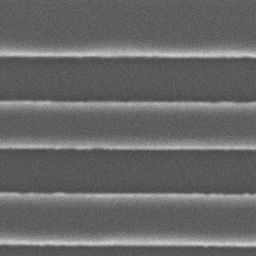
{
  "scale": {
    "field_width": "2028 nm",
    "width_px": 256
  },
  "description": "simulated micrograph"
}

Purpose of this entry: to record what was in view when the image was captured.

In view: lines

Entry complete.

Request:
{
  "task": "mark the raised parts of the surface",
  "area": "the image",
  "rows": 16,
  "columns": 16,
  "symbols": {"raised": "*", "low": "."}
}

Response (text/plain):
****************
****************
****************
................
................
................
****************
****************
****************
................
................
................
****************
****************
****************
................